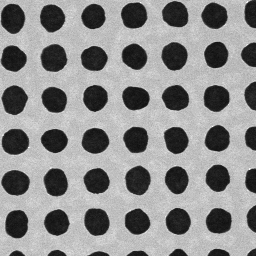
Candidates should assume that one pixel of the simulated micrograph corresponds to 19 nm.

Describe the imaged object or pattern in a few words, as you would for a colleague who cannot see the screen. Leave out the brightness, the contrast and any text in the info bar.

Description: a regular array of holes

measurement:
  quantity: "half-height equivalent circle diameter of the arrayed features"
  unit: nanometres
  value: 483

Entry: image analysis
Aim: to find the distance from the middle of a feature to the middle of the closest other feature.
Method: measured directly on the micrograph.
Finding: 758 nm